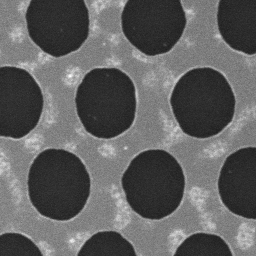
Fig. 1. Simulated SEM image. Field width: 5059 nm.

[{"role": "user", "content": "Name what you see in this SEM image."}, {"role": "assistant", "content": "holes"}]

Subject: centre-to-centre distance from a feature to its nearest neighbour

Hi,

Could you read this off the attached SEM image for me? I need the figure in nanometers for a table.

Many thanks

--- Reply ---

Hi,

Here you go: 1870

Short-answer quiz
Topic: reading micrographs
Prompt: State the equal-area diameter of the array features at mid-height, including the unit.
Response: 1.34 µm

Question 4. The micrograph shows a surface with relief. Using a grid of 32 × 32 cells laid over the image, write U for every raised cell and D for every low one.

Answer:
UUUUDDDDDDDUUUUUDDDDDDDUUUUDDDDD
UUUDDDDDDDDUUUUDDDDDDDDUUUUDDDDD
UUUDDDDDDDDUUUUDDDDDDDDUUUUDDDDD
UUUDDDDDDDDUUUUDDDDDDDDUUUUDDDDD
UUUUDDDDDDDUUUUUDDDDDDDUUUUUDDDD
UUUUDDDDDDUUUUUUDDDDDDUUUUUUDDDD
UUUUUUDDDUUUUUUUUUDDDUUUUUUUUUDD
UUUUUUUUUUUUUUUUUUUUUUUUUUUUUUUU
DDDUUUUUUUUUDDDUUUUUUUUUUDUUUUUU
DDDDUUUUUUUDDDDDUUUUUUUDDDDDUUUU
DDDDDUUUUUDDDDDDDUUUUUDDDDDDDUUU
DDDDDUUUUUDDDDDDDUUUUDDDDDDDDUUU
DDDDDUUUUDDDDDDDDUUUUDDDDDDDDUUU
DDDDDUUUUUDDDDDDDUUUUDDDDDDDDUUU
DDDDDUUUUUDDDDDDDUUUUUDDDDDDDUUU
DDDDDUUUUUDDDDDDDUUUUUDDDDDDDUUU
DDDDUUUUUUUDDDDDUUUUUUUDDDDDUUUU
UUUUUUUUUUUUUUUUUUUUUUUUUUUUUUUU
UUUUUUDUUUUUUUUUUUUUUUUUUUUUUUDD
UUUUUDDDDDUUUUUUUDDDDDUUUUUUUDDD
UUUUDDDDDDUUUUUUDDDDDDUUUUUUDDDD
UUUUDDDDDDDUUUUUDDDDDDDUUUUDDDDD
UUUDDDDDDDDUUUUDDDDDDDDUUUUDDDDD
UUUDDDDDDDDUUUUDDDDDDDDUUUUDDDDD
UUUUDDDDDDDUUUUUDDDDDDDUUUUDDDDD
UUUUDDDDDDDUUUUUDDDDDDDUUUUUDDDD
UUUUUDDDDDUUUUUUUDDDDDUUUUUUUDDD
UUUUUUUDDUUUUUUUUUUDUUUUUUUUUUUU
UUUUUUUUUUUUUUUUUUUUUUUUUUUUUUUU
DDDUUUUUUUUDDDDUUUUUUUUUDDDUUUUU
DDDDUUUUUUDDDDDDUUUUUUUDDDDDUUUU
DDDDDUUUUUDDDDDDDUUUUUDDDDDDDUUU